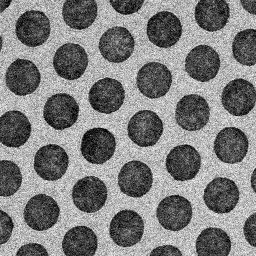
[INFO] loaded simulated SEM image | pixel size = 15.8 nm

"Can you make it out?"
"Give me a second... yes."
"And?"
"a regular array of holes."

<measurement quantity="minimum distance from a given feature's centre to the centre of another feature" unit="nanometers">788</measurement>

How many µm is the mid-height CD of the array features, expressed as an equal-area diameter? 0.581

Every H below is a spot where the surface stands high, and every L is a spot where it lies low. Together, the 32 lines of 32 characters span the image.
LHHHHHHHLLLLHHLLLLHHHHHHHLLLHHLL
HHHLLHHHLLLLHHHLLHHHLHHHLLLLLHHL
HHLLLLHHLLLLHHHHHHHLLLHHLLLLLHHH
HHLLLLHHHLLHHHLLHHLLLLLHHLLLHHHH
HHLLLLHHHHHHHLLLLHLLLLLHHHHHHLLL
HHHLLHHHLLHHLLLLLHHLLLHHHHHHHLLL
HHHHHHHLLLLHLLLLLHHHHHHHLLLHHLLL
HHLLHHHLLLLHHLLLHHHHHHHLLLLLHHLL
HLLLLHHLLLLHHHHHHHLLLHHLLLLHHHHH
HLLLLHHLLLHHHHHHHLLLLHHHLLLHHHHH
HLLLLHHHHHHHLLLHHLLLLHHHHHHHLLLH
HLLLHHHHHHHLLLLLHHLLLHHHHHHHLLLL
HHHHHHLLLHHLLLLLHHHHHHLLLLHHLLLL
HHHHHLLLLLHHLLLHHHHHHHLLLLHHLLLL
LLLHHLLLLLHHHHHHHLLLHHLLLLHHHLHH
LLLLHHLLLHHHHHHHLLLLHHLLLLHHHHHH
LLLLHHHHHHHLLLHHLLLLHHHHHHHLLLHH
LLLHHHHHHHLLLLHHLLLLHHHHHHHLLLLH
HLHHHLLLHHLLLLHHHHHHHHLLHHHLLLLH
HHHHLLLLHHLLLLHHHHHHHLLLLHHLLLLH
LLHHLLLLLHHHHHHHLLHHHLLLLHHHHHHH
LLLHLLLLHHHHHHHLLLLHHLLLLHHHHHHH
LLLHHHLHHHLLLHHLLLLHHHLLHHHLLHHL
LLHHHHHHHLLLLHHLLLLHHHHHHHLLLLHL
LHHHLLHHHLLLLHHHLLHHHLLHHLLLLLHH
HHHLLLLHHLLLLHHHHHHHLLLLHHLLLLHH
LHHLLLLHHHHLHHHLLHHHLLLLHHHLLHHH
LLHLLLLHHHHHHHLLLLHHLLLLHHHHHHHL
LLHHLLHHHLLHHHLLLLHHLLLHHHLHHHLL
LHHHHHHHLLLLHHLLLLHHHHHHHLLLLHHL
HHHLLHHHLLLLHHLLLHHHHHHHLLLLLHHL
HHLLLLHHLLLLHHHHHHHLLLLHHLLLLHHH